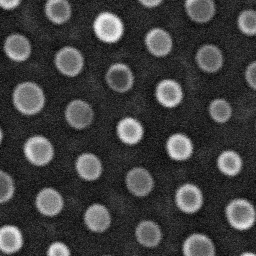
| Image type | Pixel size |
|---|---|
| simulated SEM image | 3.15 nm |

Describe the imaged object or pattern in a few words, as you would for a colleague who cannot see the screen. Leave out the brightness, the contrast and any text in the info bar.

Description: a regular array of raised bodies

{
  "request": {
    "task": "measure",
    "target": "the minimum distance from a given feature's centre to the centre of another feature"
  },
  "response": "164 nanometres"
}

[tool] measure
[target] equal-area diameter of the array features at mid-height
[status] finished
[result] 79.8 nanometres